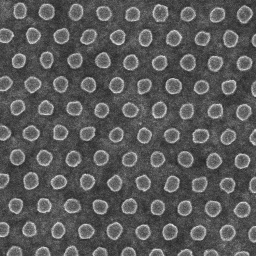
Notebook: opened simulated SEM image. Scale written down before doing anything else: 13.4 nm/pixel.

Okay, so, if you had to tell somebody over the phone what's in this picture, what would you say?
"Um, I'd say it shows a regular array of raised bodies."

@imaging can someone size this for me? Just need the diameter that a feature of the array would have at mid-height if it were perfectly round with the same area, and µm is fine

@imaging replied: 0.2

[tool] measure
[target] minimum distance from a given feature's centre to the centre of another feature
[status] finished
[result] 365 nanometers